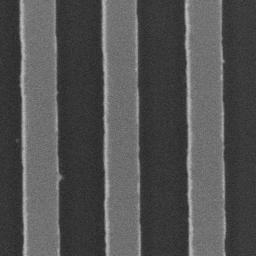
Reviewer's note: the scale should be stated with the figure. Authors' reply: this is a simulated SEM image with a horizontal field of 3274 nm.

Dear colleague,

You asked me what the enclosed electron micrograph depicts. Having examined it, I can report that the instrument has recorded lines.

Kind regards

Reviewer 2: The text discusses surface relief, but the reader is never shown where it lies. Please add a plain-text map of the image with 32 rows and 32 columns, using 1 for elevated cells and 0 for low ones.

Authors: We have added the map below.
00011110000001111000000111110000
00011110000001111000000111110000
00011110000001111000000111110000
00011110000001111000000111110000
00011110000001111000000111110000
00011110000001111000000111110000
00011110000001111000000111110000
00011110000001111000000111110000
00011110000001111000000111110000
00011110000001111000000111110000
00011110000001111000000111110000
00011110000001111000000111110000
00011110000001111000000111110000
00011110000001111000000111110000
00011110000001111000000111110000
00011110000001111000000011110000
00011110000001111000000011110000
00011110000001111000000011110000
00011110000001111000000011110000
00011110000001111000000111110000
00011110000001111000000111110000
00011110000001111000000011110000
00011110000001111000000011110000
00011110000001111000000011110000
00011110000001111000000011110000
00011110000001111000000011110000
00011110000001111000000011110000
00011110000001111000000011110000
00011110000001111000000011110000
00011110000001111000000011110000
00011110000001111000000011110000
00011110000001111000000011110000